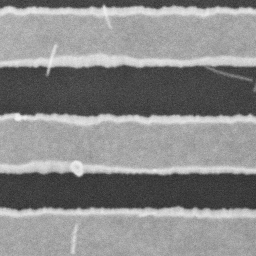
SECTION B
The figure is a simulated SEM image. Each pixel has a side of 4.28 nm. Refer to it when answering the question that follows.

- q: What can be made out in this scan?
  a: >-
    lines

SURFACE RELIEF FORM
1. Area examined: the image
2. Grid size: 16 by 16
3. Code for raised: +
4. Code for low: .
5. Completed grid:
+.......+.......
++++++++++++++++
++++++++++++++++
++++++++++++++++
................
................
................
++++++++++++++++
++++++++++++++++
++++++++++++++++
++++++++++++++++
................
................
++++++++++++++++
++++++++++++++++
++++++++++++++++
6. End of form